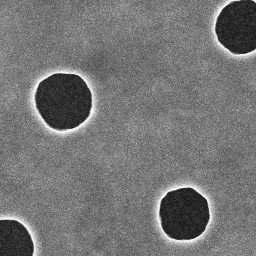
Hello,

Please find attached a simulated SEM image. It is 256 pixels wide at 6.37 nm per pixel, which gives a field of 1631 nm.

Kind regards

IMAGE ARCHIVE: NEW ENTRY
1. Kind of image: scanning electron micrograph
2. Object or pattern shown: holes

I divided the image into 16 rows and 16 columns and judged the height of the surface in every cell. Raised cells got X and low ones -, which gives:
XXXXXXXXXXXXXX--
XXXXXXXXXXXXXX--
XXXXXXXXXXXXXX--
XXXXXXXXXXXXXXXX
XXXXXXXXXXXXXXXX
XX----XXXXXXXXXX
XX----XXXXXXXXXX
XXX--XXXXXXXXXXX
XXXXXXXXXXXXXXXX
XXXXXXXXXXXXXXXX
XXXXXXXXXXXXXXXX
XXXXXXXXXXXXXXXX
XXXXXXXXXX---XXX
XXXXXXXXXX---XXX
--XXXXXXXX---XXX
--XXXXXXXXXXXXXX